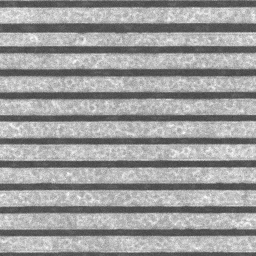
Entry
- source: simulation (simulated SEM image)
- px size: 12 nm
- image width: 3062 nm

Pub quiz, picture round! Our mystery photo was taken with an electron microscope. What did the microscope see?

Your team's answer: parallel lines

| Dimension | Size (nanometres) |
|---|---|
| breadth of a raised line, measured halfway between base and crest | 180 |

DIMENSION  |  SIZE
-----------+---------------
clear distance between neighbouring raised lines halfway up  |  94.2 nm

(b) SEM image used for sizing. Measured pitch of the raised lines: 0.273 um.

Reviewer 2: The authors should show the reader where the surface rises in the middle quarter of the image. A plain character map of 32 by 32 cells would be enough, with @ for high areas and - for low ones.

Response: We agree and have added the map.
@@@@@@@@@@@@@@@@@@@@@@@@@@@@@@@@
--------------------------------
--------------------------------
@@@@@@@@@@@@@@@@@@@@@@@@@@@@@@@@
@@@@@@@@@@@@@@@@@@@@@@@@@@@@@@@@
@@@@@@@@@@@@@@@@@@@@@@@@@@@@@@@@
@@@@@@@@@@@@@@@@@@@@@@@@@@@@@@@@
--------------------------------
--------------------------------
@@@@@@@@@@@@@@@@@@@@@@@@@@@@@@@@
@@@@@@@@@@@@@@@@@@@@@@@@@@@@@@@@
@@@@@@@@@@@@@@@@@@@@@@@@@@@@@@@@
@@@@@@@@@@@@@@@@@@@@@@@@@@@@@@@@
--------------------------------
--------------------------------
@@@@@@@@@@@@@@@@@@@@-@@@@@@@@@@@
@@@@@@@@@@@@@@@@@@@@@@@@@@@@@@@@
@@@@@@@@@@@@@@@@@@@@@@@@@@@@@@@@
--------------------------------
--------------------------------
@@@@@@@@@@@@@@@@@@@@@@@@@@@@@@@@
@@@@@@@@@@@@@@@@@@@@@@@@@@@@@@@@
@@@@@@@@@@@@@@@@@@@@@@@@@@@@@@@@
@@@@@@@@@@@@@@@@@@@@@@@@@@@@@@@@
--------------------------------
--------------------------------
@@@@@@@@@@@@@@@@@@@@@@@@@@@@@@@@
@@@@@@@@@@@@@@@@@@@@@@@@@@@@@@@@
@@@@@@@@@@@@@@@@@@@@@@@@@@@@@@@@
@@@@@@@@@@@@@@@@@@@@@@@@@@@@@@@@
--------------------------------
--------------------------------